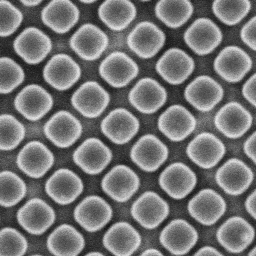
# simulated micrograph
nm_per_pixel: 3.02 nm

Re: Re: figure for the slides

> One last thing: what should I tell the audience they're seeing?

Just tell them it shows a regular array of raised bodies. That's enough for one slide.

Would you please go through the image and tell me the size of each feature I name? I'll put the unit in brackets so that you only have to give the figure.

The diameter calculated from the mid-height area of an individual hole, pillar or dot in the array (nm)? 101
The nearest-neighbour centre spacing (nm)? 119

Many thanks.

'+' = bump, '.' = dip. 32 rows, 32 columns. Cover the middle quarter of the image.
+++......+++++++++.....+++++++++
++++.....+++++++++......++++++++
++++.....+++++++++......+++++++.
+++.......+++++++........+++++..
++.........+++++...++++....++...
+....++++.........++++++.......+
....++++++.......++++++++......+
...++++++++......++++++++......+
..+++++++++......++++++++......+
..+++++++++......++++++++.......
...+++++++........++++++........
....++++++.........++++...++++..
+....+++....+++++........++++++.
++.........+++++++......++++++++
+++.......++++++++......++++++++
++++......++++++++......++++++++
++++......++++++++......++++++++
++++......+++++++........++++++.
+++.........++++....+++....+++..
++...++++....++....+++++........
....++++++........+++++++......+
...++++++++......+++++++++.....+
...++++++++......+++++++++.....+
...++++++++......++++++++.......
...++++++++.......+++++++.......
....++++++.........+++++...+++..
.....++++...++++.....+...++++++.
++.........++++++........+++++++
+++.......++++++++......++++++++
++++......++++++++......++++++++
++++......++++++++......++++++++
++++......++++++++.......+++++++